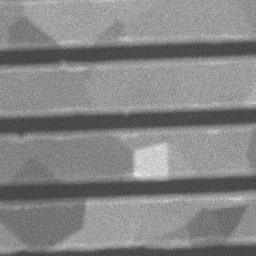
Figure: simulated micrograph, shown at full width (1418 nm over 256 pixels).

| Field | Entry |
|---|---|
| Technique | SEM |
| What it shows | one or a few lines or trenches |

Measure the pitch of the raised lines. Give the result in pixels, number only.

67.8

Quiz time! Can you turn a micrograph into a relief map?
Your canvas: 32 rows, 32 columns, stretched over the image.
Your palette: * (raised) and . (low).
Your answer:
********************************
********************************
********************************
********************************
********************************
*********..*....................
................................
.............................***
..*.****************************
********************************
********************************
********************************
********************************
***********************.........
................................
................................
..................**************
********************************
********************************
********************************
********************************
********************************
*********.......................
................................
...........................*.***
.**.****************************
********************************
********************************
********************************
********************************
************************........
................................